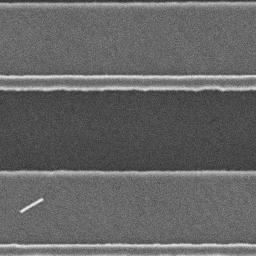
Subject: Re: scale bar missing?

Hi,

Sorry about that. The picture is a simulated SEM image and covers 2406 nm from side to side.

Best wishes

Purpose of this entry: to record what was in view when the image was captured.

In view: lines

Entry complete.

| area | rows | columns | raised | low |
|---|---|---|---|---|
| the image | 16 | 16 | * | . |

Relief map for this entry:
****************
****************
****************
****************
****************
****************
................
................
................
................
................
****************
****************
****************
****************
****************